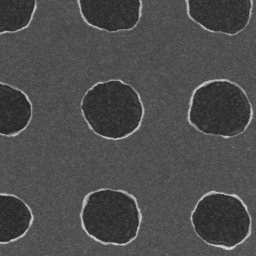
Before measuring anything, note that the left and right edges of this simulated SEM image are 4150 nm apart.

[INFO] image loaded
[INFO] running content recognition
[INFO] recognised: holes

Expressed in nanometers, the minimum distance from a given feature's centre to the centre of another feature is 1740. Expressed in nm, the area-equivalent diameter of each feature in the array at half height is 921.